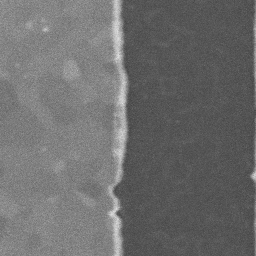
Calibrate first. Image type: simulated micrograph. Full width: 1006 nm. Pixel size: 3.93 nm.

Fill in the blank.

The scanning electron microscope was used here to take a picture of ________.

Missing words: one or a few lines or trenches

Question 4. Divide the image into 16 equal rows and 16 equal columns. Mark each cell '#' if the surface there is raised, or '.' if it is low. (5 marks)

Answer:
#######.........
#######.........
#######.........
#######.........
########........
########........
########........
########........
########........
########........
#######.........
#######.........
#######.........
#######.........
#######.........
#######.........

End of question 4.